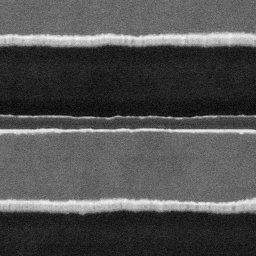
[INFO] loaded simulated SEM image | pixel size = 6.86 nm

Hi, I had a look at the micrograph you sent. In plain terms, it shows lines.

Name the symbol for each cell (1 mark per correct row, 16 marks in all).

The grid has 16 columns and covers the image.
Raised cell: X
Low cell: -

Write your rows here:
XXXXXXXXXXXXXXXX
XXXXXXXXXXXXXXXX
---XXX--X-------
----------------
----------------
----------------
----------------
XXXXXXXXXXXXXXXX
XXXXXXXXXXXXXXXX
XXXXXXXXXXXXXXXX
XXXXXXXXXXXXXXXX
XXXXXXXXXXXXXXXX
XXXXXXXXXXXXXXXX
----------------
----------------
----------------